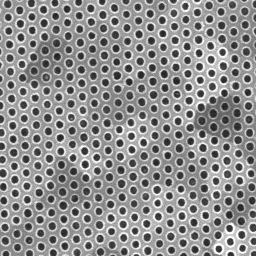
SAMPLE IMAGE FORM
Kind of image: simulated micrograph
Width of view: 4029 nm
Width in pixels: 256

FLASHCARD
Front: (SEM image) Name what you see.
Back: a regular array of holes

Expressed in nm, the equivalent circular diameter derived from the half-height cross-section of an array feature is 130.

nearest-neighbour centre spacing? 210 nm